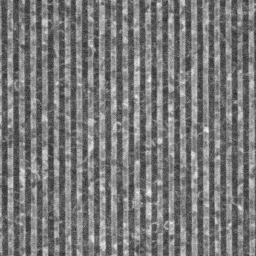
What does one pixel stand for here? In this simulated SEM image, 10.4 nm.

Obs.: parallel lines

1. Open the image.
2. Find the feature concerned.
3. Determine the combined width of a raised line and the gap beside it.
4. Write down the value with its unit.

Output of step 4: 0.119 µm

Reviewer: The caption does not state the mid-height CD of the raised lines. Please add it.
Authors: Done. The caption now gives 48.1 nanometers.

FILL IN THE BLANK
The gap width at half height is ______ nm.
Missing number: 67.6